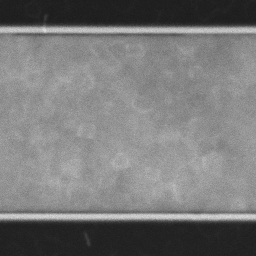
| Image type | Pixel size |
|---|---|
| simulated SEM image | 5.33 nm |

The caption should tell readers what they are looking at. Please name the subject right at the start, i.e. one or a few lines or trenches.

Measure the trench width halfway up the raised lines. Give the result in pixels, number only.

185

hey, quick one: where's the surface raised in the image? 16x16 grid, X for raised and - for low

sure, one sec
XXXXXXXXXXXXXXXX
XXXXXXXXXXXXXXXX
----------------
----------------
----------------
----------------
----------------
----------------
----------------
----------------
----------------
----------------
----------------
-------XXXX-----
XXXXXXXXXXXXXXXX
XXXXXXXXXXXXXXXX